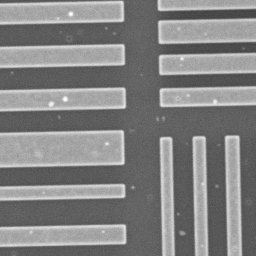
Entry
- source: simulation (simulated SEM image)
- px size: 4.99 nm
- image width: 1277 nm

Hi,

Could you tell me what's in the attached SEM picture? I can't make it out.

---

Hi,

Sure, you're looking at groups of lines, slits or small figures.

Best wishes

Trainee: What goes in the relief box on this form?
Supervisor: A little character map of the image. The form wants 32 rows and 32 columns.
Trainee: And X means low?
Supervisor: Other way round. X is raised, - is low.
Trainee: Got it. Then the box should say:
-XXXXXXXXXXXXXX-----XXXXXXXXXXXX
XXXXXXXXXXXXXXX-----------------
XXXXXXXXXXXXXXX---------XXXXXXXX
--------------------XXXXXXXXXXXX
--------------------XXXXXXXXXXXX
--------------------------------
XXXXXXXXXXXXXXXX----------------
XXXXXXXXXXXXXXXX----XXXXXXXXXXXX
--------------------XXXXXXXXXXXX
--------------------------------
--------------------------------
XXXXXXXXXXXXXXXX----XXXXXXXXXXXX
XXXXXXXXXXXXXXXX----XXXXXXXXXXXX
XXXXXXXXXXXXXXX-----------------
--------------------------------
--------------------------------
-------XXXXXXXX-----------------
XXXXXXXXXXXXXXX-----X---XX--XX--
XXXXXXXXXXXXXXX-----XX--XX--XX--
XXXXXXXXXXXXXXX-----XX--XX--XX--
XXXXXXXXXXXXXXX-----XX--XX--XX--
--------------------XX--XX--XX--
--------------------XX--XX--XX--
XXXXXXXXXXXXXXXX----XX--XX--XX--
XXXXXXXXXXXXXXX-----XX--XX--XX--
--------------------XX--XX--XX--
--------------------XX--XX--XX--
--------------------XX--XX--XX--
XXXXXXXXXXXXXXXX----XX--XX--XX--
XXXXXXXXXXXXXXXX----XX--XX--XX--
XXXXXXXXXXXXXX------XX--XX--XX--
--------------------XX--XX--XX--